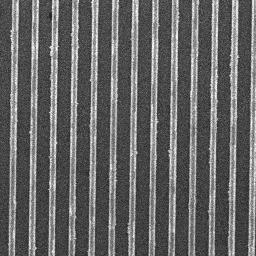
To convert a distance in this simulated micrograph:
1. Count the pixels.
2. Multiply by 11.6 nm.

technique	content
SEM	parallel lines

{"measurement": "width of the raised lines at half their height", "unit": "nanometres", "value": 55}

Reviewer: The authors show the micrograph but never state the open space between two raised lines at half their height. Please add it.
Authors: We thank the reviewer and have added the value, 0.172 microns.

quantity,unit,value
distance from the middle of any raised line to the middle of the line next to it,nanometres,232